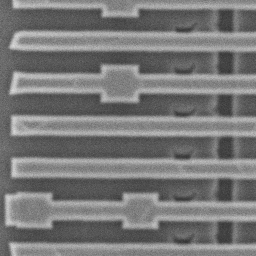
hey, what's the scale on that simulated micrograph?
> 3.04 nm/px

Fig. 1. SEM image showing wiring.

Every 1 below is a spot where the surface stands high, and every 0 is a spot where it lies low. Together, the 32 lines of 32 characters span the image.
00111111111111111111111111111111
00000000000001111000000000000000
00000000000000000000000000000000
00000000000000000000000000000000
00111111111111111111111111111111
00111111111111111111111111111111
00000000000000000000000000000000
00000000000000000000000000000000
00000000000001111000000000000000
00111111111111111111110011100000
00111111111111111111111111111111
00100000000011111111111111111111
00000000000001111000000000000000
00000000000000000000000000000000
00000000000000000000000000000000
00111111111111111111111111111111
00111111111111111111111111111111
00000000000000000000000000000000
00000000000000000000000000000000
00000000000000000000000000000000
00111111111111111111111111111111
00111111111111111111111111111111
00000000000000000000000000000000
00000000000000000000000000000000
00111100000000001110000000000000
01111111111111111111111111111111
01111111111111111111111111111111
01111110000000011111000000000000
00000000000000000000000000000000
00000000000000000000000000000000
00000000000000000000000000000000
00111111111111111111111111111111